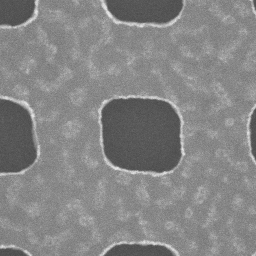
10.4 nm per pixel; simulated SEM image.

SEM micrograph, holes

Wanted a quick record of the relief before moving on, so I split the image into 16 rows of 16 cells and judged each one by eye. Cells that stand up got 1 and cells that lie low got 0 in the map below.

0011111000011111
0111111111111111
1111111111111111
1111111111111111
1111111111111111
1111111111111111
0111111000011111
0011110000011111
0011110000011111
0011111000011111
0011111100011111
1111111111111111
1111111111111111
1111111111111111
1111111111111111
1111111000111111